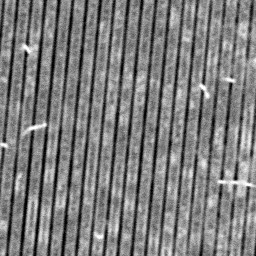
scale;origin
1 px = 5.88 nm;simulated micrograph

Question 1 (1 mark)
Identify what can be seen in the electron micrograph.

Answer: parallel lines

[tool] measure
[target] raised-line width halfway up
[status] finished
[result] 56.3 nm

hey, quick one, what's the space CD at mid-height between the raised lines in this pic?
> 0.0249 um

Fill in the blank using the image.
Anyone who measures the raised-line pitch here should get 80.9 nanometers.